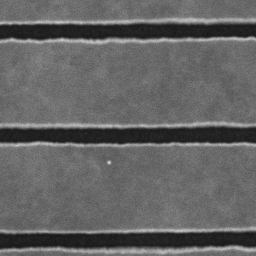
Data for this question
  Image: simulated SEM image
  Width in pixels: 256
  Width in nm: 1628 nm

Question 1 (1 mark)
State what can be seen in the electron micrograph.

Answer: lines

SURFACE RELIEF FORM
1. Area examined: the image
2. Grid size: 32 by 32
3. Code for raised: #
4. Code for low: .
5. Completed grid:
################################
################################
################################
................................
................................
################################
################################
################################
################################
################################
################################
################################
################################
################################
################################
################################
................................
................................
################################
################################
################################
################################
################################
################################
################################
################################
################################
################################
################################
................................
................................
################################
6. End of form